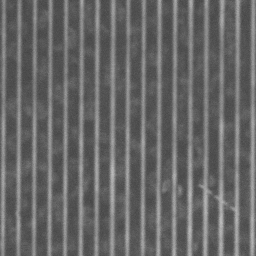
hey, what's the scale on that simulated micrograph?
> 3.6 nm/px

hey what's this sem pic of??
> parallel lines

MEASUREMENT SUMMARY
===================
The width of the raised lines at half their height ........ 0.0099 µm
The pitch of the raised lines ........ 0.0562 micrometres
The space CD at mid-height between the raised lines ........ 45.9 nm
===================